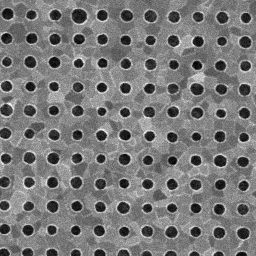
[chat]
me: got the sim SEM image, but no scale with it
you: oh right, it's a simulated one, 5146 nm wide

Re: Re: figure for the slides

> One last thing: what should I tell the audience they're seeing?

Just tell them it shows a regular array of holes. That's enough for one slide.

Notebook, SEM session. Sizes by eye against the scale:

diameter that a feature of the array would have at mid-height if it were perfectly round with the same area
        229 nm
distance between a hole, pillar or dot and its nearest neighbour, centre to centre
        470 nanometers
